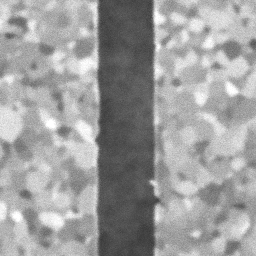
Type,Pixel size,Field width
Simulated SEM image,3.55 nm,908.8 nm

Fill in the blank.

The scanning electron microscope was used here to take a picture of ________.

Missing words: one or a few lines or trenches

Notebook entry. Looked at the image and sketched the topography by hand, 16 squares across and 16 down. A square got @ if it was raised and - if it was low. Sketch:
@@@@@@----@@@@@@
@@@@@@----@@@@@@
@@@@@@----@@@@@@
@@@@@@----@@@@@@
@@@@@@----@@@@@@
@@@@@@----@@@@@@
@@@@@@----@@@@@@
@@@@@@----@@@@@@
@@@@@@----@@@@@@
@@@@@@----@@@@@@
@@@@@@----@@@@@@
@@@@@@----@@@@@@
@@@@@@----@@@@@@
@@@@@@----@@@@@@
@@@@@@----@@@@@@
@@@@@@----@@@@@@